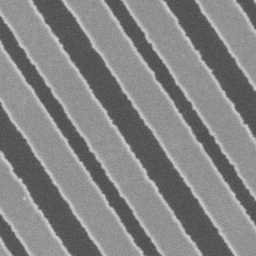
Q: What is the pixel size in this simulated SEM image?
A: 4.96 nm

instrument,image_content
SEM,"lines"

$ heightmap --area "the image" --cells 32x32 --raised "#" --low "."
####....#####...#####....#####..
#####....#####..#####....######.
.#####....#####..#####....#####.
.#####....#####...#####....#####
..#####....#####..#####....#####
..######...######..#####....####
#..#####....#####..######....###
#...#####....#####..#####....###
##..######....#####..#####....##
###..#####....#####...#####....#
####..#####....#####..#####....#
####..######....#####..#####....
#####..#####....#####...#####...
######..#####....#####..#####...
.#####..######....#####..#####..
..#####..#####....#####...#####.
..######..#####....#####..#####.
...#####...#####....#####..#####
....#####..#####....#####...####
#...######..#####....#####..####
#....#####...#####....#####..###
##....#####..#####....#####...##
###...######..#####....#####..##
###....#####...#####....#####..#
####....#####..#####....#####...
####.....#####..#####....#####..
#####....#####...#####....#####.
.#####....#####..#####....#####.
.#####.....#####..#####....#####
..#####....#####...#####....####
#..#####....#####..#####....####
#..######....#####..#####....###